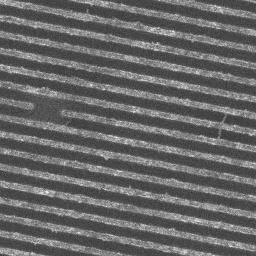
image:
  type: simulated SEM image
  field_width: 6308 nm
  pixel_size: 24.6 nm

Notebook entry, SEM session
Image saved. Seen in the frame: parallel lines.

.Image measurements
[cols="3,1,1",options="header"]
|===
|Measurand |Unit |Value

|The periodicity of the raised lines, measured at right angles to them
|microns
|0.402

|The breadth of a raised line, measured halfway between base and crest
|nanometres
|176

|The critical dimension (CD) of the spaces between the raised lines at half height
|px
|8.84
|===